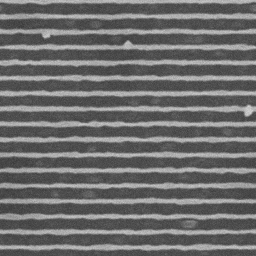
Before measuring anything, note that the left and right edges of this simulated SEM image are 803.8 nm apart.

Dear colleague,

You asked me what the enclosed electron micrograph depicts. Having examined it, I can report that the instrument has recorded parallel lines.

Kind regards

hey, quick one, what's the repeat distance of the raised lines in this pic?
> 48.4 nm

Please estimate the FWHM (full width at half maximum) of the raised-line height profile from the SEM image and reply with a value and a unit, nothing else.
12.2 nm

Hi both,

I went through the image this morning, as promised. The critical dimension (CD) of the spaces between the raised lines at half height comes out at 36.1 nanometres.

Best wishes